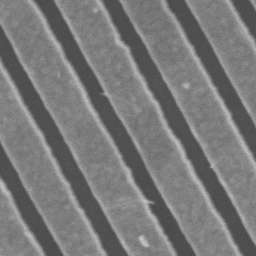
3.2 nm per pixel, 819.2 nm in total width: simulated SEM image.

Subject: lines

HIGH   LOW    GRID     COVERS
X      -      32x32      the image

XXXX---XXXXXX--XXXXXX--XXXXXX---
XXXXX---XXXXX---XXXXX---XXXXXX--
XXXXXX--XXXXXX--XXXXXX---XXXXX--
XXXXXX---XXXXX---XXXXXX--XXXXXX-
-XXXXXX--XXXXXX--XXXXXX---XXXXX-
-XXXXXX---XXXXXX--XXXXXX--XXXXXX
--XXXXXX--XXXXXX---XXXXX---XXXXX
--XXXXXX---XXXXXX--XXXXXX--XXXXX
X--XXXXXX--XXXXXX---XXXXXX--XXXX
X---XXXXXX--XXXXXX--XXXXXX--XXXX
XX--XXXXXX---XXXXX---XXXXXX--XXX
XX---XXXXXX--XXXXXX--XXXXXX---XX
XXX--XXXXXX---XXXXX---XXXXXX--XX
XXX---XXXXXX--XXXXXX--XXXXXX---X
XXXX--XXXXXX---XXXXX---XXXXXX--X
XXXX---XXXXXX--XXXXXX---XXXXX---
XXXXX---XXXXX---XXXXX---XXXXXX--
XXXXXX--XXXXXX---XXXXX---XXXXX--
XXXXXX---XXXXXX--XXXXXX--XXXXXX-
-XXXXXX--XXXXXX---XXXXX---XXXXXX
--XXXXX---XXXXXX--XXXXXX--XXXXXX
--XXXXXX--XXXXXX---XXXXX---XXXXX
---XXXXX---XXXXXX--XXXXXX--XXXXX
X--XXXXXX--XXXXXX---XXXXXX--XXXX
X---XXXXX---XXXXXX--XXXXXX---XXX
XX--XXXXXX--XXXXXXX--XXXXXX--XXX
XX---XXXXX---XXXXXX--XXXXXX---XX
XXX--XXXXXX---XXXXXX--XXXXXX--XX
XXX---XXXXXX--XXXXXX---XXXXX---X
XXXX---XXXXX---XXXXXX--XXXXXX--X
XXXXX--XXXXXX--XXXXXX---XXXXX---
XXXXX---XXXXX---XXXXXX--XXXXXX--